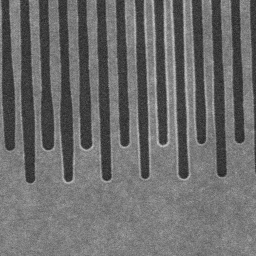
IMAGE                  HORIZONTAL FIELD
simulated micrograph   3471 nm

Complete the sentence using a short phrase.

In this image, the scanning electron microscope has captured groups of lines, slits or small figures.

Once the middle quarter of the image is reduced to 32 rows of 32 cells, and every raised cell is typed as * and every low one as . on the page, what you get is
.***..**...**...**...**...*...**
.***..***..**...**...**...*...**
..**..***..**...**...**...**..**
..**...**..**...**...**...**..**
..**...**..**...**...**...**..**
..**...**..**...**...**...**...*
..**...**..**...**...**...**...*
..**...**..**...**...**...**...*
..**...**...*...**...**...**...*
..**...**...**..**...**...**...*
..**...**...**..**...**...**...*
..**...**...**..**...**...**...*
..**...**...**..**...**...**...*
..**...**...**...*...**...**...*
..**...**...**...*...**...**...*
..**...**...**...*...**...**...*
..**...**...**...**..**...**...*
..**...**...**...**..**...**...*
..**...**...**...**..**...**...*
..**...**...**...**..***..**...*
..**...**...**..***...******...*
...******...*******...******...*
..*******...*******...******...*
..*******...*******...******...*
..*******...*******...******...*
..*******...*******...******...*
..*******...*******...******...*
..*******...*******...******...*
..*******...*******..********..*
*.******************************
********************************
********************************